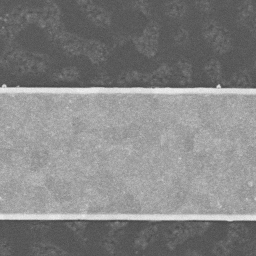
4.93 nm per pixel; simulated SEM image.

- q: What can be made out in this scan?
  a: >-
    one or a few lines or trenches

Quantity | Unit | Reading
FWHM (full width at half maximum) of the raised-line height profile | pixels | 127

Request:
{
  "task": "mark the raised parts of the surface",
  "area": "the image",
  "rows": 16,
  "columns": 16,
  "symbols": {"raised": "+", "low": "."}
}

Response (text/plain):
................
................
................
................
................
................
++++++++++++++++
++++++++++++++++
++++++++++++++++
++++++++++++++++
++++++++++++++++
++++++++++++++++
++++++++++++++++
++++++++++++++++
................
................